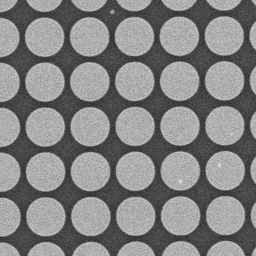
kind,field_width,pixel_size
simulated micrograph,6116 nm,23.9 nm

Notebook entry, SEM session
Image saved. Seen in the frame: an array of small figures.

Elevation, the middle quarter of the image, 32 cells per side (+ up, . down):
....+++++......++++++.....++++++
...+++++++....++++++++...+++++++
..+++++++++..+++++++++..++++++++
..+++++++++..+++++++++..++++++++
..+++++++++..+++++++++..++++++++
..+++++++++..+++++++++..++++++++
..+++++++++..+++++++++...+++++++
...+++++++....+++++++....+++++++
....+++++......+++++.......++++.
................................
................................
....+++++......+++++......++++++
...+++++++....+++++++....+++++++
..+++++++++..+++++++++...+++++++
..+++++++++..+++++++++..++++++++
..+++++++++..++++++++++.++++++++
..+++++++++..+++++++++..++++++++
..+++++++++..+++++++++...+++++++
...+++++++....++++++++...+++++++
....+++++......++++++.....++++++
................................
................................
.....++++.......++++.......++++.
...+++++++....+++++++....+++++++
..+++++++++...++++++++...+++++++
..+++++++++..+++++++++..++++++++
..+++++++++..++++++++++.++++++++
..+++++++++..++++++++++.++++++++
..+++++++++..+++++++++...+++++++
...++++++++...++++++++...+++++++
...+++++++.....++++++.....++++++
.....+++.........++.............